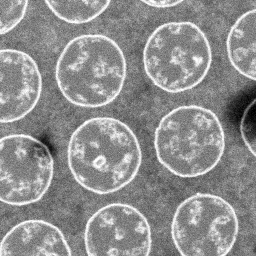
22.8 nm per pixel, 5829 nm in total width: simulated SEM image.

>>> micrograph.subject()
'raised bodies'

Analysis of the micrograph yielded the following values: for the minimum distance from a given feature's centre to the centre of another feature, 85.4 px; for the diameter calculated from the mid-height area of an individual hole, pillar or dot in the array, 69.6 pixels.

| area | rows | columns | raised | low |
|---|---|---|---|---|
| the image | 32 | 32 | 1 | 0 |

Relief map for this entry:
11100011111110000001110000000000
11100001111100000000000000000000
11000000111000000000000000000011
10000000000000000000111100000111
00000000000000000001111110000111
00000000011111000011111111000111
11000000111111100011111111000111
11110001111111100011111111000111
11110001111111110011111111000011
11111001111111100001111110000001
11111001111111100000111100000000
11111000111111100000000000000000
11111000011111000000000000000000
11110000000000000000000110000001
11100000000000000000011111100001
00000000000111100000111111100011
00000000001111110000111111110011
11110000011111111000111111110001
11111100011111111000111111110001
11111100011111111000111111100000
11111100011111111000011111100000
11111100011111111000001110000000
11111100001111110000000000000000
11111100000111100000000000000000
11111000000000000000000000000000
00000000000000000000000111110000
00000000000011111000001111111000
00000000000111111100001111111000
00111110000111111110001111111100
01111111000111111110001111111000
11111111000111111110001111111000
11111111100111111100000111110000